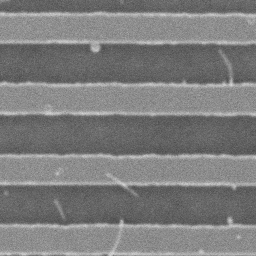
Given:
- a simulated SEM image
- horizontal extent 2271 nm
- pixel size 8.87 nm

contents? lines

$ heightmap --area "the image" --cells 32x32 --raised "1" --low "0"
00000000000000000000000000000000
00000000000000000000000000000000
11111111111111111111111111111111
11111111111111111111111111111111
11111111111111111111111111111111
00000000000000000000000000000000
00000000000000000000000000000000
00000000000000000000000000000000
00000000000000000000000000000000
00000000000000000000000000000000
11111100011111110111110000001011
11111111111111111111111111111111
11111111111111111111111111111111
11111111111111111111111111111111
00000000000000000000000000000000
00000000000000000000000000000000
00000000000000000000000000000000
00000000000000000000000000000000
00000000000000000000000000000000
11111111111111000111101111111000
11111111111111111111111111111111
11111111111111111111111111111111
11111111111111111111111111111111
00000000000000000000000000000000
00000000000000000000000000000000
00000000000000000000000000000000
00000000000000000000000000000000
00000000000000000000000000000000
11111111111111111111111111111111
11111111111111111111111111111111
11111111111111111111111111111111
11111111111111111111111111111111